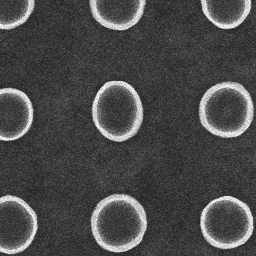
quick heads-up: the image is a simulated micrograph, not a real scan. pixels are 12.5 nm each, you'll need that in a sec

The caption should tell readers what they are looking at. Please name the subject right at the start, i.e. raised bodies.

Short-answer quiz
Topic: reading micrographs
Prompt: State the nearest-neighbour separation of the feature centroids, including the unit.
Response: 108 pixels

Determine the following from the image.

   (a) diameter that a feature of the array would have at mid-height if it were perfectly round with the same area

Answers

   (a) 632 nm